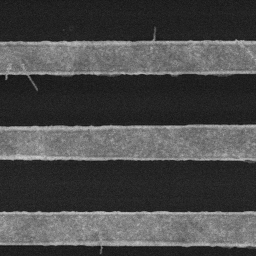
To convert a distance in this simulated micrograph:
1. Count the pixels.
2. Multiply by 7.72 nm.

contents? lines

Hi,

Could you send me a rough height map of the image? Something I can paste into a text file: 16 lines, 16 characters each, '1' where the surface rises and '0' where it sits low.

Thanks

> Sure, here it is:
0000000000000000
0000000000000000
0000000000000000
1111111111111111
1111111111111111
0000000000000000
0000000000000000
0000000000000000
1111111111111111
1111111111111111
0000000000000000
0000000000000000
0000000000000000
1111111111111111
1111111111111111
0000000000000000